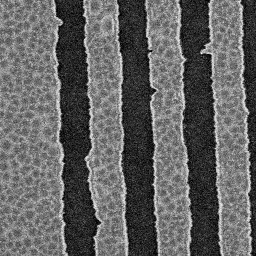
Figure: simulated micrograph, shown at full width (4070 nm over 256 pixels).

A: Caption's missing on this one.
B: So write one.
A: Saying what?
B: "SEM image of one or a few lines or trenches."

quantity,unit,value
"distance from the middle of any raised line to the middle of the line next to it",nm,1000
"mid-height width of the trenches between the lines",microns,0.496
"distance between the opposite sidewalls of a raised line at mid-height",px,31.2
